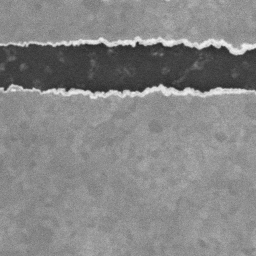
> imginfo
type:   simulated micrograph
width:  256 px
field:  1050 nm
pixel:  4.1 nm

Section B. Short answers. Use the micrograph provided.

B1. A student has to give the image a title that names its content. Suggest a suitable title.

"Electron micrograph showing one or a few lines or trenches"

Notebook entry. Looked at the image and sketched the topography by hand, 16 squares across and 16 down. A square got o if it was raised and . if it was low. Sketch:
oooooooooooooooo
oooooooooooooooo
oooooooooooooooo
................
................
.........oo.....
oooooooooooooooo
oooooooooooooooo
oooooooooooooooo
oooooooooooooooo
oooooooooooooooo
oooooooooooooooo
oooooooooooooooo
oooooooooooooooo
oooooooooooooooo
oooooooooooooooo